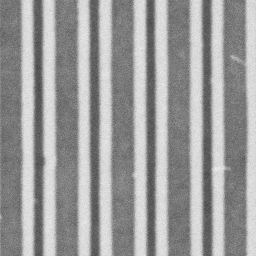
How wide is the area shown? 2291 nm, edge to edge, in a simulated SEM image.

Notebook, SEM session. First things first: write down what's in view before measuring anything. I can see parallel lines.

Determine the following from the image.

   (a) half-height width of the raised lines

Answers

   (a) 101 nm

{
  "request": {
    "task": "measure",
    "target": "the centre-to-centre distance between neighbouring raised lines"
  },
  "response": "0.243 um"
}